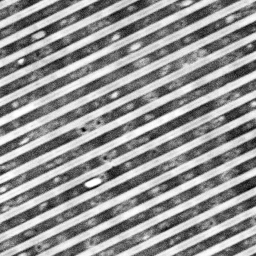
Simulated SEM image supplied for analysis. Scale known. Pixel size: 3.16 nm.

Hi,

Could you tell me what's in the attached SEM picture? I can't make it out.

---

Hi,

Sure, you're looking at parallel lines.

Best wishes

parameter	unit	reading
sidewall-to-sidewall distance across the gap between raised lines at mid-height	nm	34.5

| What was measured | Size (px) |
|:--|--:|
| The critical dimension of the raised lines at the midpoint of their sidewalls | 6.77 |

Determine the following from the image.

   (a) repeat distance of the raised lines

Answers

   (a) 55.1 nm